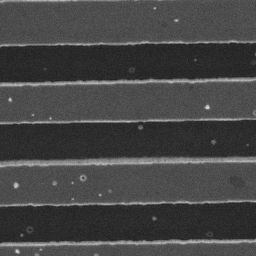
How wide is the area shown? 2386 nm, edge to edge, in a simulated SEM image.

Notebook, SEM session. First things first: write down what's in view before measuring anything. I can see lines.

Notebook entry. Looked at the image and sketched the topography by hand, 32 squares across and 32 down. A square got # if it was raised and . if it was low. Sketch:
################################
################################
################################
################################
################################
########.###....................
................................
................................
................................
................................
#.##############################
################################
################################
################################
################################
................................
................................
................................
................................
................................
....#.##########################
################################
################################
################################
################################
###########..#..................
................................
................................
................................
................................
...#############################
################################